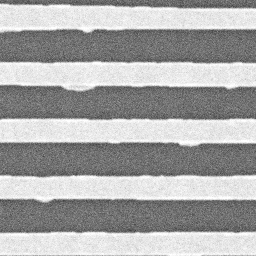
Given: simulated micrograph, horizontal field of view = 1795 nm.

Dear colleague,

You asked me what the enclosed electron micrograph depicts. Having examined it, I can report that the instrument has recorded lines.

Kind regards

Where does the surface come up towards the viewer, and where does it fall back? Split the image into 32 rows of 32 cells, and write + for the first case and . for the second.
................................
++++++++++++++++++++++++++++++++
++++++++++++++++++++++++++++++++
++++++++++++++++++++++++++++++++
................................
................................
................................
................................
++++++++++++++++++++++++++++++++
++++++++++++++++++++++++++++++++
...+++++++++++++++++++++++++++++
................................
................................
................................
................................
++++++++++++++++++++++++++++++++
++++++++++++++++++++++++++++++++
++++++++++++++++++++++++++++++++
................................
................................
................................
................................
++++++++++++++++++++++++++++++++
++++++++++++++++++++++++++++++++
++++++++++++++++++++++++++++++++
................................
................................
................................
................................
++++++++++++++++++++++++++++++++
++++++++++++++++++++++++++++++++
++++++++++++++++++++++++++++++++